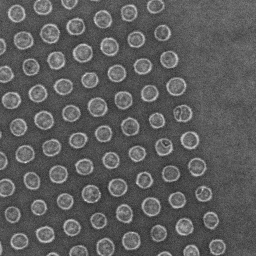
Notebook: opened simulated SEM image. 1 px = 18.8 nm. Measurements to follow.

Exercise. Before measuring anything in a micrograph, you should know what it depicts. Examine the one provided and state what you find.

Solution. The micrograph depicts a regular array of raised bodies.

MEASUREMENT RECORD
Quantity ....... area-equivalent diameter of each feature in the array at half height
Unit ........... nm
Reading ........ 302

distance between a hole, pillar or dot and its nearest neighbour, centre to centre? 0.505 µm